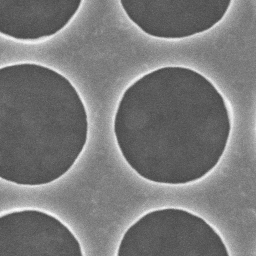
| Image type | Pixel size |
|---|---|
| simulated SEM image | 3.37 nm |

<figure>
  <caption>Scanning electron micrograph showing holes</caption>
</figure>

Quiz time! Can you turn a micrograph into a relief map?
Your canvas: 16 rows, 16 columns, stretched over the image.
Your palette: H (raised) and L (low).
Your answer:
LLLLLHHHLLLLLLHH
LLLLHHHHLLLLLHHH
HLHHHHHHHHHHHHHH
HHHHHHHHHHHHHHHH
LLLLHHHHHLLLHHHH
LLLLLHHHLLLLLHHH
LLLLLHHLLLLLLLHH
LLLLLHHLLLLLLLHH
LLLLLHHLLLLLLLHH
LLLLLHHHLLLLLLHH
LLLLHHHHLLLLLHHH
HLLHHHHHHHLHHHHH
HHHHHHHHHHHHHHHH
LLLHHHHHHLLLHHHH
LLLLHHHHLLLLLLHH
LLLLLHHLLLLLLLHH